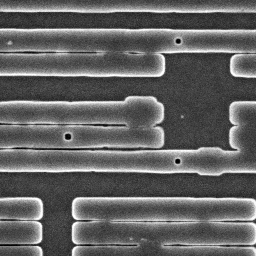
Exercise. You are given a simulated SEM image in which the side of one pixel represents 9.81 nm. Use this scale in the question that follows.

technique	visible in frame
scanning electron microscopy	wiring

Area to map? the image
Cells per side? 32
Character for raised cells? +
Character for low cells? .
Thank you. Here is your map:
++++++++++++++++++++++++++++++++
..........++++.....++++++++.....
................................
................................
++++++++++++++++++++++++++++++++
++++++++++++++++++++++++++++++++
++++++++++++++++++++++.......+++
+++++++++++++++++++++........+++
+++++++++++++++++++++........+++
...........+++.+++++.........+++
................................
................................
................+++.............
++++++++++++++++++++.........+++
++++++++++++++++++++.........+++
++++++++++++++++++++.........+++
++++++++++++++++++++.........+++
++++++++++++++++++++.........+++
++++++++++++.......+.........+++
++++++++++++++++++++++++++++++++
++++++++++++++++++++++++++++++++
..................++++++++++++++
................................
................................
................................
+++++....+++++++++++++++++++++++
+++++....+++++++++++++++++++++++
+++++.....++++++++++++++++++++++
+++++....+++++++++++++++++++++++
+++++....+++++++++++++++++++++++
+++++....+++++++++++++++++++++++
+++++....+++++++++++++++++++++++